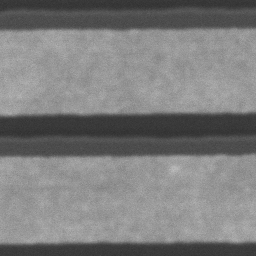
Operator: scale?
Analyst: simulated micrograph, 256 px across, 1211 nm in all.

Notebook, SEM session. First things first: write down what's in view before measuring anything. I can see lines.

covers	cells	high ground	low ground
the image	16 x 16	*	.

................
................
****************
****************
****************
****************
****************
................
................
................
****************
****************
****************
****************
****************
................